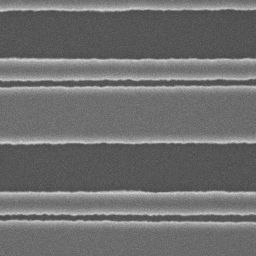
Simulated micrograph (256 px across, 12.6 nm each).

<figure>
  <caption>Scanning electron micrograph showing lines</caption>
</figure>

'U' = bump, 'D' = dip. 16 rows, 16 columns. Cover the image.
UUUUUUUUUUUUUUUU
DDDDDDDDDDDDDDDD
DDDDDDDDDDDDDDDD
DDDDDDDDDDDDDDDD
UUUUUUUUUUUUUUUU
UUUUUUUUUUUUUUUU
UUUUUUUUUUUUUUUU
UUUUUUUUUUUUUUUU
UUUUUUUUUUUUUUUU
DDDDDDDDDDDDDDDD
DDDDDDDDDDDDDDDD
DDDDDDDDDDDDDDDD
UUUUUUUUUUUUUUUU
UUUUUUUUUUUUUUUU
UUUUUUUUUUUUUUUU
UUUUUUUUUUUUUUUU